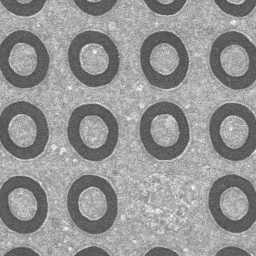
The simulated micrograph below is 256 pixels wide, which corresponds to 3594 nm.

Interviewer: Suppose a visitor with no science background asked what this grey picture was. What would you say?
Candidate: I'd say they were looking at ring-shaped grooves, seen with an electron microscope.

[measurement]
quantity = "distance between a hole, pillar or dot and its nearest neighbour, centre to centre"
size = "70.7 px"